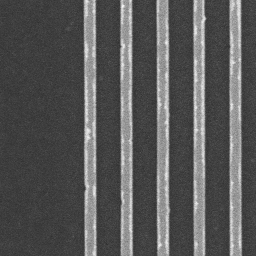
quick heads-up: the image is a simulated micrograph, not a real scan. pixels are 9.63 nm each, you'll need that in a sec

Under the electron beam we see parallel lines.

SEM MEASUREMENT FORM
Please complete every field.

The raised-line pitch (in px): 36.3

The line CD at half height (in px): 10.8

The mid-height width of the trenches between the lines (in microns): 0.243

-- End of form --